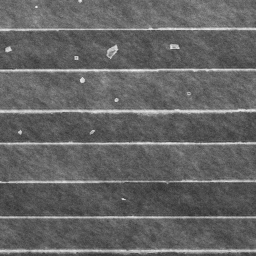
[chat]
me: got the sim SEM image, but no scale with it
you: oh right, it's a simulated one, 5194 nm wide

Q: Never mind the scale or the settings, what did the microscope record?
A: lines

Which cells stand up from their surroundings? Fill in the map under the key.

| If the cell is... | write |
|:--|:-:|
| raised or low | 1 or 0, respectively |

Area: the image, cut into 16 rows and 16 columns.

1111111111111111
1111111111111111
0000000000000000
0000000000000000
1111111111111111
1111111111111111
1111111111111111
0000000000000000
0000000000000000
1111111111111111
1111111111111111
0000000000000000
0000000000000000
0000000000000000
1111111111111111
1111111111111111